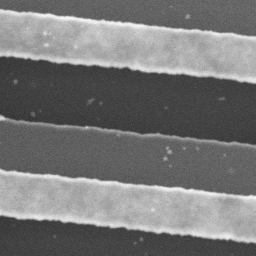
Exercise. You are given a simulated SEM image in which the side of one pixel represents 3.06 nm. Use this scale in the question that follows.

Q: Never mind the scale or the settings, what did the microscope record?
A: lines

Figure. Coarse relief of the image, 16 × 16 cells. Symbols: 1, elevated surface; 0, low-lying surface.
1111111111111111
1111111111111111
1111111111111111
1111111111111111
0000000001111111
0000000000000000
0000000000000000
1000000000000000
1111111111100000
1111111111111111
1111111111111111
1111111111111111
1111111111111111
1111111111111111
0000000001111111
0000000000000000